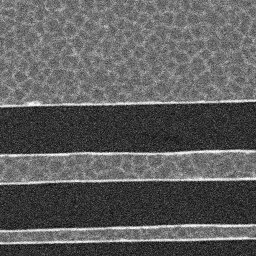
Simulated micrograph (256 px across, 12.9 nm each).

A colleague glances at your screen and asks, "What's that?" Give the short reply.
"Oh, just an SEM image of one or a few lines or trenches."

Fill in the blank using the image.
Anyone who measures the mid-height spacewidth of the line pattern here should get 621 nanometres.